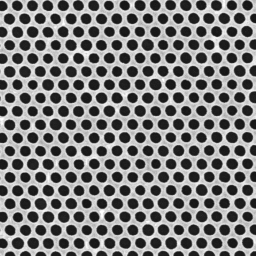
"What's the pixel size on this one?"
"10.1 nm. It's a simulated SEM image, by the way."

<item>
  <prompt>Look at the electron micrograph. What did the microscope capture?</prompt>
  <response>a regular array of holes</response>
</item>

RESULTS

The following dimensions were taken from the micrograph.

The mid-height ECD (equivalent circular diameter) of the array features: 0.111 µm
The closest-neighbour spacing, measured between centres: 149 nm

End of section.